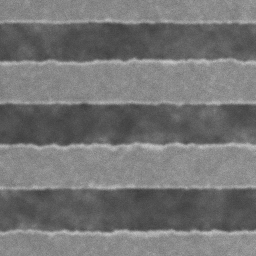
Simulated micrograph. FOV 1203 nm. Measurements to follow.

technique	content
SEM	lines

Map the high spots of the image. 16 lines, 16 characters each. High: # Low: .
################
................
................
................
################
################
.........#.###..
................
................
################
################
################
................
................
.##....#.##.##.#
################